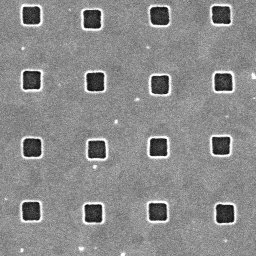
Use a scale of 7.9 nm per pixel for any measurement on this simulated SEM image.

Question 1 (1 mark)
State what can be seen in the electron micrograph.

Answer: a regular array of holes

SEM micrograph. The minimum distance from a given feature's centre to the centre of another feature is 0.492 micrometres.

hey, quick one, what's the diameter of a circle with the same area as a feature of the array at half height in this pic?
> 168 nanometers